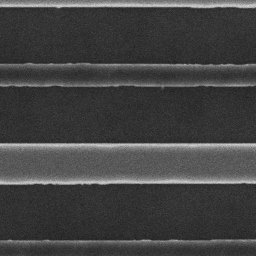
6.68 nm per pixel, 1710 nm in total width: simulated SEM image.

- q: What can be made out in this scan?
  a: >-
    lines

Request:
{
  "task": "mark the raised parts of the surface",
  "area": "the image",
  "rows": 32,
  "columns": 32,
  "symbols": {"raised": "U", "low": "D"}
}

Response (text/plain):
UUUUUUUUUUUUUUUUUUUUUUUUUUUUUUUU
DDDDDDDDDDDDDDDDDDDDDDDDDDDDDDDD
DDDDDDDDDDDDDDDDDDDDDDDDDDDDDDDD
DDDDDDDDDDDDDDDDDDDDDDDDDDDDDDDD
DDDDDDDDDDDDDDDDDDDDDDDDDDDDDDDD
DDDDDDDDDDDDDDDDDDDDDDDDDDDDDDDD
DDDDDDDDDDDDDDDDDDDDDDDDDDDDDDDD
DDDDDDDDDDDDDDDDDDDDDDDDDDDDDDDD
UUUUUUUUUUUUUUUUUUUUUUUUUUUUUUUU
UUUUUUUUUUUUUUUUUUUUUUUUUUUUUUUU
UUUUUUUUUUUUUUUUUUUUUUUUUUUUUUUU
DDDDDDDDDDDDDDDDDDDDDDDDDDDDDDDD
DDDDDDDDDDDDDDDDDDDDDDDDDDDDDDDD
DDDDDDDDDDDDDDDDDDDDDDDDDDDDDDDD
DDDDDDDDDDDDDDDDDDDDDDDDDDDDDDDD
DDDDDDDDDDDDDDDDDDDDDDDDDDDDDDDD
DDDDDDDDDDDDDDDDDDDDDDDDDDDDDDDD
DDDDDDDDDDDDDDDDDDDDDDDDDDDDDDDD
UUUUUUUUUUUUUUUUUUUUUUUUUUUUUUUU
UUUUUUUUUUUUUUUUUUUUUUUUUUUUUUUU
UUUUUUUUUUUUUUUUUUUUUUUUUUUUUUUU
UUUUUUUUUUUUUUUUUUUUUUUUUUUUUUUU
UUUUUUUUUUUUUUUUUUUUUUUUUUUUUUUU
DDDDDDDDDDDDDDDDDDDDDDDDDDDDDDDD
DDDDDDDDDDDDDDDDDDDDDDDDDDDDDDDD
DDDDDDDDDDDDDDDDDDDDDDDDDDDDDDDD
DDDDDDDDDDDDDDDDDDDDDDDDDDDDDDDD
DDDDDDDDDDDDDDDDDDDDDDDDDDDDDDDD
DDDDDDDDDDDDDDDDDDDDDDDDDDDDDDDD
DDDDDDDDDDDDDDDDDDDDDDDDDDDDDDDD
UUUUUUUUUUUUUUUUUUUUUUUUUUUUUUUU
UUUUUUUUUUUUUUUUUUUUUUUUUUUUUUUU